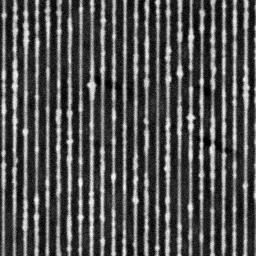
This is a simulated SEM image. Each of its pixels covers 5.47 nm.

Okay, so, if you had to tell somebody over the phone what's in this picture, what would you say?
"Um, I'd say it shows parallel lines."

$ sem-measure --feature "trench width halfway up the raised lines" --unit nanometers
44.5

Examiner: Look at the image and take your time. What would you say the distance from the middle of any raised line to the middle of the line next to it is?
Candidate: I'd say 11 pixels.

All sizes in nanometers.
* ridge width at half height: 15